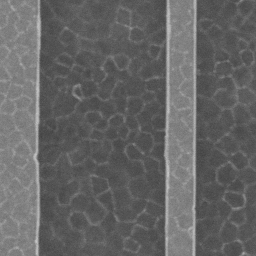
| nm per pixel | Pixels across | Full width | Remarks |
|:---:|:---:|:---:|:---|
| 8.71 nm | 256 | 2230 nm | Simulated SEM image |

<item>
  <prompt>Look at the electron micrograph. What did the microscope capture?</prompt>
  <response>one or a few lines or trenches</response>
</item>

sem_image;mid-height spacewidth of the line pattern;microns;1.12